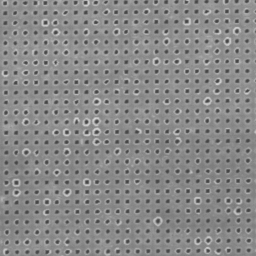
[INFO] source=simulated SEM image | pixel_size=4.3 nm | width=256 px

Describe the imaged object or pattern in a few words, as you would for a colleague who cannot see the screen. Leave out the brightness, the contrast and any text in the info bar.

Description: a regular array of holes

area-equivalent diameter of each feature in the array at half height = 17.5 nm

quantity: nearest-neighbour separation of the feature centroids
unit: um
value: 0.041